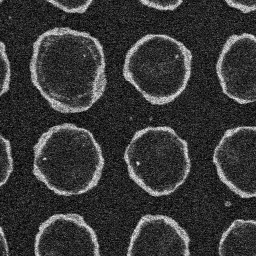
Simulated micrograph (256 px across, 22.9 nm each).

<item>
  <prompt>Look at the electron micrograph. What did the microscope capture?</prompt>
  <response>raised bodies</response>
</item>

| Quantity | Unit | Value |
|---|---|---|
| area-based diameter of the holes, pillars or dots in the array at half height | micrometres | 1.49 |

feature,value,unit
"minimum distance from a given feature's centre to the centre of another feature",2060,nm